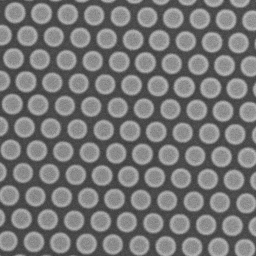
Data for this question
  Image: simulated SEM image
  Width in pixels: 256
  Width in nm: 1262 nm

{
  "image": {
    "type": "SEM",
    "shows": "an array of small figures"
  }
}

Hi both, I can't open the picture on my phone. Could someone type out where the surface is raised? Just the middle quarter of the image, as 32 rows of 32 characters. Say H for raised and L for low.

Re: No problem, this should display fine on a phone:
HHHLLHHHHLLLHHHHLLHHHHHLLHHHHLLH
LLLLLLHHLLLLHHHLLLLHHHLLLHHHHLLH
LLLLLLLLLLLLLLLLLLLLLLLLLLLLLLLL
LLHHHHLLHHHHLLLHHHHLLLHHHLLLLHHL
LHHHHHLLHHHHHLLHHHHLLHHHHHLLHHHH
LHHHHHLLHHHHHLHHHHHLLHHHHHLLHHHH
LLHHHLLLHHHHLLLHHHHLLHHHHHLLHHHH
LLLLLLLLLLLLLLLLHHLLLLHHHLLLHHHH
HHLLLLHHLLLLLLLLLLLLLLLLLLLLLLLL
HHLLLHHHHLLHHHHLLLHHHHLLLHHHLLLL
HHHLHHHHHLLHHHHHLLHHHHLLHHHHHLLH
HHLLLHHHHLLHHHHHLLHHHHLLHHHHHLLH
HLLLLHHHLLLLHHHLLLHHHHLLHHHHHLLH
LLLLLLLLLLLLLLLLLLLLLLLLLHHHLLLL
LLHHHLLLLHHLLLLHHHLLLLLLLLLLLLLL
LHHHHHLLHHHHLLHHHHHLLHHHHLLLHHHL
LHHHHHLLHHHHLLHHHHHLLHHHHLLHHHHH
LHHHHLLLHHHHLLHHHHHLLHHHHLLHHHHH
LLHHLLLLHHHLLLLHHHLLLHHHHLLLHHHH
LLLLLLLLLLLLLLLLLLLLLLLLLLLLLLLL
HHLLLHHHLLLHHHHLLLHHHLLLLHHLLLLL
HHLLHHHHHLLHHHHLLHHHHHLLHHHHLLLH
HHLLHHHHHLLHHHHLLHHHHHLLHHHHHLHH
HHLLHHHHLLLHHHHLLHHHHHLLHHHHHLHH
LLLLLLHLLLLLHHLLLLHHHLLLHHHHLLLH
LLHHLLLLLHLLLLLLLLLLLLLLLLLLLLLL
LHHHHLLHHHHHLLHHHHLLLHHHLLLLHHLL
LHHHHLLHHHHHLLHHHHHLHHHHHLLHHHHL
LHHHHLLHHHHHLLHHHHHLHHHHHLLHHHHH
LHHHHLLLHHHLLLHHHHLLHHHHHLLHHHHH
LLLLLLLLLLLLLLLHHLLLLLHHLLLLHHHL
HLLLHHHLLLLLHHLLLLLLLLLLLLLLLLLL